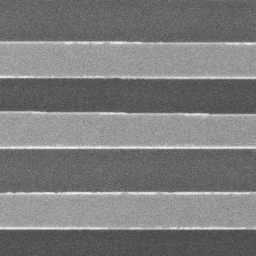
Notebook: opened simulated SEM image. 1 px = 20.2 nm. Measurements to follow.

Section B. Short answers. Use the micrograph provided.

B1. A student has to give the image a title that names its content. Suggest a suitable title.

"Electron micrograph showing lines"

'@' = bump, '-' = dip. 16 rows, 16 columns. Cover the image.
----------------
----------------
----------------
@@@@@@@@@@@@@@@@
@@@@@@@@@@@@@@@@
----------------
----------------
@@@@@@@@@@@@@@@@
@@@@@@@@@@@@@@@@
----------------
----------------
----------------
@@@@@@@@@@@@@@@@
@@@@@@@@@@@@@@@@
----------------
----------------